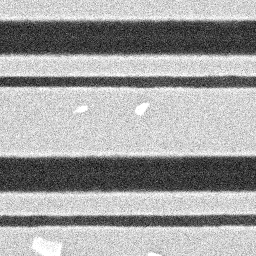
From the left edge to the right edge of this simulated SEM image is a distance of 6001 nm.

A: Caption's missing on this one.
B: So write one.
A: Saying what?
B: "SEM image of lines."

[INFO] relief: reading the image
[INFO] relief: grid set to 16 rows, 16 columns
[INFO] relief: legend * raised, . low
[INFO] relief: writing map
****************
................
................
................
****************
****************
****************
****************
****************
****************
................
................
****************
****************
****************
****************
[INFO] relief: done